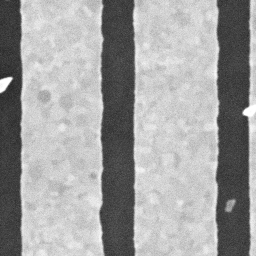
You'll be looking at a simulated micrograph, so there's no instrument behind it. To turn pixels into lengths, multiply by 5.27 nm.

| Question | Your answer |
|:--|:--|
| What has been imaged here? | lines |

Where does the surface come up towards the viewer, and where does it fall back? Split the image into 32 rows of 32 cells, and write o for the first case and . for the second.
...oooooooooo....oooooooooo....o
...oooooooooo....oooooooooo....o
...oooooooooo....oooooooooo....o
...oooooooooo....oooooooooo....o
...oooooooooo....oooooooooo....o
...oooooooooo....oooooooooo....o
...oooooooooo....oooooooooo....o
...oooooooooo....oooooooooo....o
...oooooooooo....oooooooooo....o
...oooooooooo....oooooooooo....o
o..oooooooooo....oooooooooo....o
...oooooooooo....oooooooooo....o
...oooooooooo....oooooooooo....o
...oooooooooo....oooooooooo....o
...oooooooooo....oooooooooo....o
...oooooooooo....oooooooooo....o
...oooooooooo....oooooooooo....o
...oooooooooo....oooooooooo....o
...oooooooooo....oooooooooo....o
...oooooooooo....oooooooooo....o
...oooooooooo....oooooooooo....o
...oooooooooo....oooooooooo....o
...oooooooooo....oooooooooo....o
...oooooooooo....oooooooooo....o
...oooooooooo....oooooooooo....o
...oooooooooo....oooooooooo....o
...ooooooooo.....oooooooooo....o
...ooooooooo.....oooooooooo....o
...oooooooooo....oooooooooo....o
...oooooooooo....oooooooooo....o
...oooooooooo....oooooooooo....o
...oooooooooo....oooooooooo....o